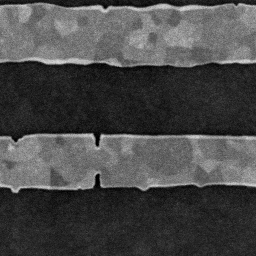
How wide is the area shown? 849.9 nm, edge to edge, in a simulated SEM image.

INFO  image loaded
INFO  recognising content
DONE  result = one or a few lines or trenches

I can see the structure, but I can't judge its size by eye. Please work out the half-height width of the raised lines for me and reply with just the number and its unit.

0.178 µm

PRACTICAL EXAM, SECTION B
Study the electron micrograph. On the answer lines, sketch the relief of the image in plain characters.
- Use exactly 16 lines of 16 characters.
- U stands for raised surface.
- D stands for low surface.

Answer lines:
UUUUUUUUUUUDUUUU
UUUUUUUUUUUUUUUU
UUUUUUUUUUUUUUUU
UUUUUUUUUUUUUUUU
DDDDDDDDDDDDDDDD
DDDDDDDDDDDDDDDD
DDDDDDDDDDDDDDDD
DDDDDDDDDDDDDDDD
DDUUUDDUUDDDDDDD
UUUUUUUUUUUUUUUU
UUUUUUUUUUUUUUUU
UUUUUUUUUUUUUUDU
DDDDDDDDDDDDDDDD
DDDDDDDDDDDDDDDD
DDDDDDDDDDDDDDDD
DDDDDDDDDDDDDDDD